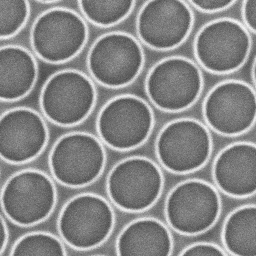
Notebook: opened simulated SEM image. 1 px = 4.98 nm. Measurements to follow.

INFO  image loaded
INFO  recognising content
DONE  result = a regular array of holes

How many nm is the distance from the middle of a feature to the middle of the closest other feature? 306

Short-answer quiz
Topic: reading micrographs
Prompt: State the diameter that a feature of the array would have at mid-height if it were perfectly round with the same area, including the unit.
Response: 264 nm